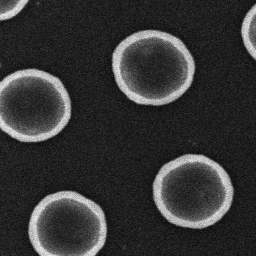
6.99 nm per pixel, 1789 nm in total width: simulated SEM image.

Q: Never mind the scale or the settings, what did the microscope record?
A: raised bodies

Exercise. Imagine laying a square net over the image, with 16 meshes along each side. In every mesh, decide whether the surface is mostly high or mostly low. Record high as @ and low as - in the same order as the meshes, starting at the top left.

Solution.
@---------------
---------------@
--------@@@----@
-------@@@@@----
-------@@@@@----
@@@@----@@@@----
@@@@------------
@@@@------------
-@@-------------
----------------
-----------@@@--
----------@@@@--
---@@-----@@@@--
--@@@@-----@@@--
--@@@@----------
--@@@@----------